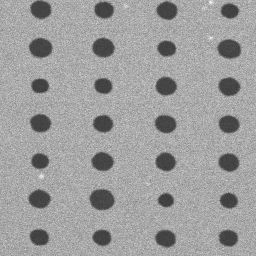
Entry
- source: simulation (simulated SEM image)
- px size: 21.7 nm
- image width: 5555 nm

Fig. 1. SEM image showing a regular array of holes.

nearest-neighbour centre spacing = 37.8 pixels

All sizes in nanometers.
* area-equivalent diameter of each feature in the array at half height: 420